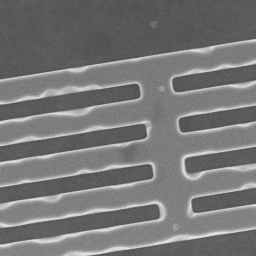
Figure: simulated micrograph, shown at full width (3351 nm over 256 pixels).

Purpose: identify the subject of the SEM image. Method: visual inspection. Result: groups of lines, slits or small figures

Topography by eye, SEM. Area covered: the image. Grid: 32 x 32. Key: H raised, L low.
LLLLLLLLLLLLLLLLLLLLLLLLLLLLLLLL
LLLLLLLLLLLLLLLLLLLLLLLLLLLLLLLL
LLLLLLLLLLLLLLLLLLLLLLLLLLLLLLLL
LLLLLLLLLLLLLLLLLLLLLLLLLLLLLLLL
LLLLLLLLLLLLLLLLLLLLLLLLLLLLLLLL
LLLLLLLLLLLLLLLLLLLLLLLLLLLLHHHH
LLLLLLLLLLLLLLLLLLLLLLHHHHHHHHHH
LLLLLLLLLLLLLLLHHHHHHHHHHHHHHHHH
LLLLLLLLLLHHHHHHHHHHHHHHHHHHLLLL
LLLHHHHHHHHHHHHHHHHHHHLLLLLLLLLL
HHHHHHHHHHHHHHHHHHHHHHLLLLLLLLLH
HHHHHHHHLLLLLLLLLLHHHHLHHHHHHHHH
HHHLLLLLLLLLLLLLLHHHHHHHHHHHHHHH
LLLLLLLLLLLHHHHHHHHHHHHHHHHHHHLL
LLLLHHHHHHHHHHHHHHHHHHHLLLLLLLLL
HHHHHHHHHHHHHHHHHLHHHHLLLLLLLLLH
HHHHHHHHHHHLLLLLLLHHHHHLHHHHHHHH
HHHLLLLLLLLLLLLLLHHHHHHHHHHHHHHH
LLLLLLLLLLLHHHHHHHHHHHHHHHHHHHHL
LLLLLLHHHHHHHHHHHHHHHHHHLLLLLLLL
HHHHHHHHHHHHHHHHHHHHHHHLLLLLLLLL
HHHHHHHHHHHHLLLLLLLHHHHLLHHHHHHH
HHHHHHLLLLLLLLLLLLLHHHHHHHHHHHHH
LLLLLLLLLLLLHHHHHHHHHHHHHHHHHHHL
LLLLLLLHHHHHHHHHHHHHHHHHHHLLLLLL
LHHHHHHHHHHHHHHHHHHLHHHHLLLLLLLL
HHHHHHHHHHHHLLLLLLLLHHHHLLHHHHHH
HHHHHHLLLLLLLLLLLLLHHHHHHHHHHHHH
LLLLLLLLLLLLLLHHHHHHHHHHHHHHHHHH
LLLLLLLLHHHHHHHHHHHHHHHHHHLLLLLL
LHHHHHHHHHHHHHHHHHHHLLLLLLLLLLLL
HHHHHHHHHHHHHLLLLLLLLLLLLLLLLLLL